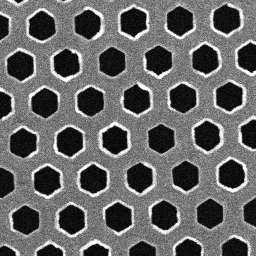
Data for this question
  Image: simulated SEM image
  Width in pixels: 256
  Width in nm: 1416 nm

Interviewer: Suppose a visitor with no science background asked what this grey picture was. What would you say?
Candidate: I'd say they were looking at a regular array of holes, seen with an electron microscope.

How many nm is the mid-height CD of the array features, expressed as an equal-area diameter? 153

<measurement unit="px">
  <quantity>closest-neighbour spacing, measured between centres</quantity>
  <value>44.7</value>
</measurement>